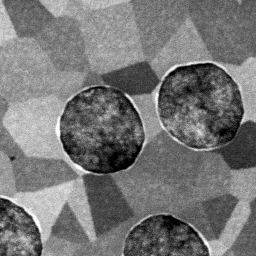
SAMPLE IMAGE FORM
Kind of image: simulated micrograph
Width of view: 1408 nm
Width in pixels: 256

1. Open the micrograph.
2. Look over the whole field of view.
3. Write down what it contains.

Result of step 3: holes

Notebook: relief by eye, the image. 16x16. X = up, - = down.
XXXXXXXXXXXXXXXX
XXXXXXXXXXXXXXXX
XXXXXXXXXXXXXXXX
XXXXXXXXXXXXXXXX
XXXXXXXXXXX---XX
XXXXXX-XXX-----X
XXXX----XX-----X
XXXX-----X-----X
XXXX-----XX----X
XXXX-----XXXXXXX
XXXXX---XXXXXXXX
XXXXXXXXXXXXXXXX
XXXXXXXXXXXXXXXX
--XXXXXXXX-XXXXX
--XXXXXX----XXXX
---XXXXX-----XXX